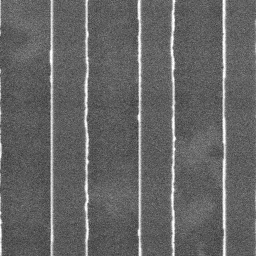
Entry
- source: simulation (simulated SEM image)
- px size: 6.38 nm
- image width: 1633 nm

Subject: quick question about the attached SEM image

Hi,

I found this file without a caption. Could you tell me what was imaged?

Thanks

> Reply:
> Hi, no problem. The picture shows lines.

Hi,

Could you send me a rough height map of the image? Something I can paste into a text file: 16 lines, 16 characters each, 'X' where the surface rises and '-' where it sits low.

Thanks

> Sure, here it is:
---XX----XX---XX
---XX----XX---XX
---XX----XX---XX
---XX----XX---XX
---XX----XX---XX
---XX----XX---XX
---XX----XX---XX
---XX----XX---XX
---XX----XX---XX
---XX----XX---XX
---XX----XX---XX
---XX----XX---XX
---XX----XX---XX
---XX----XX---XX
---XX----XX---XX
---XX----XX---XX